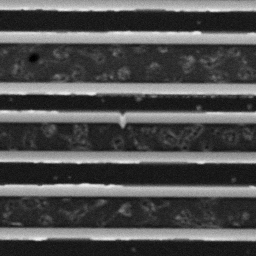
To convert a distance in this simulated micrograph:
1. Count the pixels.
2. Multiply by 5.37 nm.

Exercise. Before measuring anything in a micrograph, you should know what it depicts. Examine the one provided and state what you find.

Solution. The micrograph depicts one or a few lines or trenches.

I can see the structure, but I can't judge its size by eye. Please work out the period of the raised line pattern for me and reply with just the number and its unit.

411 nm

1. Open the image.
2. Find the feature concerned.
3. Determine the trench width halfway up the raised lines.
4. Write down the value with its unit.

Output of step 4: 0.227 microns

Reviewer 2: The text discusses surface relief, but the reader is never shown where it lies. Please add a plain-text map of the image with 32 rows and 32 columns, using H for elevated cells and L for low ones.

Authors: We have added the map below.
LLLLLLLLLLLLLLLLLLLLLLLLLLLLLLLL
HHHHHHHHHHHHHHHHHHHHHHHHHHHHHHHH
HHHHHHHHHHHHHHHHHHHHHHHHHHHHHHHH
HHHHHHHHHHHHHHHHHHHHHHHHHHHHHHHH
HHHHHHHHHHHHHHHHHHHHHHHHHHHHHHHH
LLLLLLLLLLLLLLLLLLLLLLLLLLLLLLLL
LLLLLLLLLLLLLLLLLLLLLLLLLLLLLLLL
LLLLLLLLLLLLLLLLLLLLLLLLLLLLLLLL
LLLLLLLLLLLLLLLLLLLLLLLLLLLLLLLL
LLLLLLLLLLLLLLLLLLLLLLLLLLLLLLLL
LLLLLLLLLLLLLLLLLLLLLLLLLLLLLLLL
HHHHHHHHHHHHHHHHHHHHHHHHHHHHHHHH
HHHHHHHHHHHHHHHHHHHHHHHHHHHHHHHH
HHHHHHHHHHHHHHHHHHHHHHHHHHHHHHHH
HHHHHHHHHHHHHHHHHHHHHHHHHHHHHHHH
LLLLLLLLLLLLLLLLLLLLLLLLLLLLLLLL
LLLLLLLLLLLLLLLLLLLLLLLLLLLLLLLL
LLLLLLLLLLLLLLLLLLLLLLLLLLLLLLLL
LLLLLLLLLLLLLLLLLLLLLLLLLLLLLLLL
LLLLLLLLLLLLLLLLLLLLLLLLLLLLLLLL
HHHHHHHHHHHHHHHHHHHHHHHHHHHHHHHH
HHHHHHHHHHHHHHHHHHHHHHHHHHHHHHHH
HHHHHHHHHHHHHHHHHHHHHHHHHHHHHHHH
HHHHHHHHHHHHHHHHHHHHHHHHHHHHHHHH
LLLLLLLLLLLLLLLLLLLLLLLLLLLLLLLL
LLLLLLLLLLLLLLLLLLLLLLLLLLLLLLLL
LLLLLLLLLLLLLLLLLLLLLLLLLLLLLLLL
LLLLLLLLLLLLLLLLLLLLLLLLLLLLLLLL
LLLLLLLLLLLLLLLLLLLLLLLLLLLLLLLL
HHHHHHHHHHHHHHHHHHHHHHHHHHHHHHHH
HHHHHHHHHHHHHHHHHHHHHHHHHHHHHHHH
HHHHHHHHHHHHHHHHHHHHHHHHHHHHHHHH